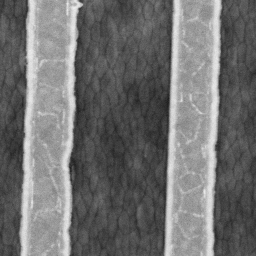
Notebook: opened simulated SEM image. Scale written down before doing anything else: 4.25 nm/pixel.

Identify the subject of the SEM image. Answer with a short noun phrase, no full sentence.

one or a few lines or trenches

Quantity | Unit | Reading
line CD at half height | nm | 172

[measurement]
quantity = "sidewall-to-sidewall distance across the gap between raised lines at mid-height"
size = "0.436 um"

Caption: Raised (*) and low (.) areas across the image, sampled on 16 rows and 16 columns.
..***......***..
..***......**...
..***......***..
..**.......**...
..**.......**...
..**.......**...
..**.......**...
..**.......**...
..**.......**...
..**.......**...
..**.......**...
..**.......**...
..**.......**...
..**.......**...
..**.......**...
..**.......**...